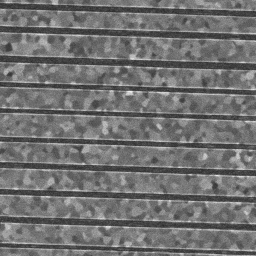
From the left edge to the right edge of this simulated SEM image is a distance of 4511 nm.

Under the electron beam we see parallel lines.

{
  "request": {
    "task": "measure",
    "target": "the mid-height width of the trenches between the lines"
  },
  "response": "112 nanometers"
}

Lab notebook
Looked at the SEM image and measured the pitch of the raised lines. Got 474 nm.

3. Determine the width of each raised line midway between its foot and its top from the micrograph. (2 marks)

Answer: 357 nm